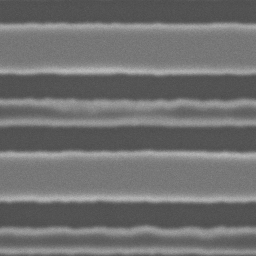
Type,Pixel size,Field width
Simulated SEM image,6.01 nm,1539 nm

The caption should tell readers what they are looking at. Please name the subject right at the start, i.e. lines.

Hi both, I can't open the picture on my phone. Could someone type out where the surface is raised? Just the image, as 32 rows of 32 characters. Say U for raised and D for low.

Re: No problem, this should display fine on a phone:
DDDDDDDDDDDDDDDDDDDDDDDDDDDDDDDD
DDDDDDDDDDDDDDDDDDDDDDDDDDDDDDDD
DDDDDDDDDDDDDDDDDDDDDDDDDDDDDDDD
UUUUUUUUUUUUUUUUUUUUUUUUUUUUUUUU
UUUUUUUUUUUUUUUUUUUUUUUUUUUUUUUU
UUUUUUUUUUUUUUUUUUUUUUUUUUUUUUUU
UUUUUUUUUUUUUUUUUUUUUUUUUUUUUUUU
UUUUUUUUUUUUUUUUUUUUUUUUUUUUUUUU
UUUUUUUUUUUUUUUUUUUUUUUUUUUUUUUU
DDDDDDDDDDDDDDDDDDDDDDDDDDDDDDDD
DDDDDDDDDDDDDDDDDDDDDDDDDDDDDDDD
DDDDDDDDDDDDDDDDDDDDDDDDDDDDDDDD
DDDUDDDDDDDDDDDDDDDDDDDDDDDDDDDD
UUUUUUUUUUUUUUUUUUUUUUUUUUUUUUUU
UUUUUUUUUUUUUUUUUUUUUUUUUUUUUUUU
UUDDDUUUUUUUUUUDDDDDDUUUUUUUUUUU
DDDDDDDDDDDDDDDDDDDDDDDDDDDDDDDD
DDDDDDDDDDDDDDDDDDDDDDDDDDDDDDDD
DDDDDDDDDDDDDDDDDDDDDDDDDDDDDDDD
UUUUUUUUUUUUUUUUUUUUUUUUUUUUUUUU
UUUUUUUUUUUUUUUUUUUUUUUUUUUUUUUU
UUUUUUUUUUUUUUUUUUUUUUUUUUUUUUUU
UUUUUUUUUUUUUUUUUUUUUUUUUUUUUUUU
UUUUUUUUUUUUUUUUUUUUUUUUUUUUUUUU
UUUUUUUUUUUUUUUUUUUUUUUUUUUUUUUU
DDDDDDDDDDDDDDDDDDDDDDDDDDDDDDDD
DDDDDDDDDDDDDDDDDDDDDDDDDDDDDDDD
DDDDDDDDDDDDDDDDDDDDDDDDDDDDDDDD
DDDDDDDDDDDDDDDDDDUDDDDDDDDDDDDD
UUUUUUUUUUUUUUUUUUUUUUUUUUUUUUUU
UUUUUUUUUUUUUUUUUUUUUUUUUUUUUUUU
UUUUUUUUUUUUUUUUUUUUUUUUUUUUUUUU